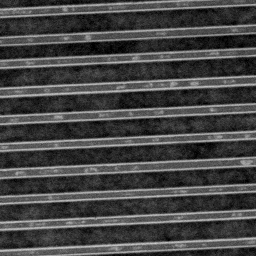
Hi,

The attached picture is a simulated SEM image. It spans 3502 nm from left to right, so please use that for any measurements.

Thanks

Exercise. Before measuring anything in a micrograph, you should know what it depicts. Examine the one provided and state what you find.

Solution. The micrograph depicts parallel lines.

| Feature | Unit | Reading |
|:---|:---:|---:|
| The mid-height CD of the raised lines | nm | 102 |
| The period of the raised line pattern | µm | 0.365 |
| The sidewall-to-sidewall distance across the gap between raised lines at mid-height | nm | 273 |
